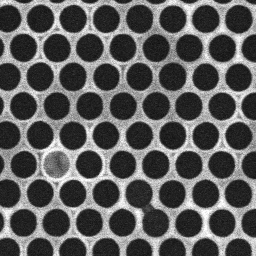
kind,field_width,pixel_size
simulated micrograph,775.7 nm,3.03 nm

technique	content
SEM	a regular array of holes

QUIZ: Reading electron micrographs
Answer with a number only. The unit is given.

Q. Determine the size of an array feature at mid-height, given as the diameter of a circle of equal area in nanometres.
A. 83.4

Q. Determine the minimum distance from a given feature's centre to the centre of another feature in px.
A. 32.9